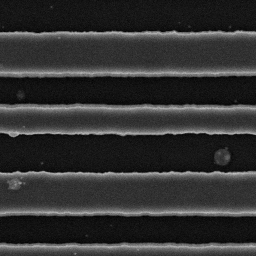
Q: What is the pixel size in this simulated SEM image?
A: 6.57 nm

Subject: lines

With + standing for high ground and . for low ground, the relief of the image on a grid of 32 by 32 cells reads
................................
................................
................................
................................
++++++++++++++++++++++++++++++++
++++++++++++++++++++++++++++++++
++++++++++++++++++++++++++++++++
++++++++++++++++++++++++++++++++
++++++++++++++++++++++++++++++++
................................
................................
................................
................................
++++++++++++++++++++++++++++++++
++++++++++++++++++++++++++++++++
++++++++++++++++++++++++++++++++
++++++++++++++++++++++++++++++++
................................
................................
................................
................................
.....+..........................
++++++++++++++++++++++++++++++++
++++++++++++++++++++++++++++++++
++++++++++++++++++++++++++++++++
++++++++++++++++++++++++++++++++
++++++++++++++++++++++++++++++++
................................
................................
................................
................................
++++++++++++++++++++++++++++++++